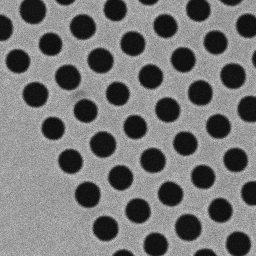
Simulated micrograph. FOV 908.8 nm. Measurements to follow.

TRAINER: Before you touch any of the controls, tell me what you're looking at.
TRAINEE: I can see a regular array of holes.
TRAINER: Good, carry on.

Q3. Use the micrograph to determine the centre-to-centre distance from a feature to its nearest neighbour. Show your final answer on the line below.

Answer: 0.13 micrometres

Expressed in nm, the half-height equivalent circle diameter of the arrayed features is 88.9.